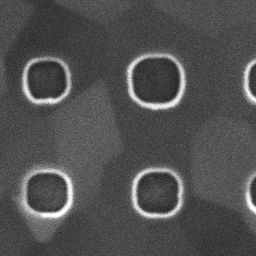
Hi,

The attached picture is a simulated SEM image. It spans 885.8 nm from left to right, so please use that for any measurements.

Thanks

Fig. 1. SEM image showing holes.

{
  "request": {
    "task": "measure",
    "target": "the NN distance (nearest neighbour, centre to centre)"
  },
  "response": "381 nm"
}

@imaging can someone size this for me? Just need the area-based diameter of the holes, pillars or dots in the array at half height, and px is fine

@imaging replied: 43.5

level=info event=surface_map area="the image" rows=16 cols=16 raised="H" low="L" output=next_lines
HHHHHHHHHHHHHHHH
HHHHHHHHHHHHHHHH
HHHHHHHHHHHHHHHH
HHHHHHHHHHHHHHHH
HHLLHHHHLLLHHHHH
HHLLHHHHLLLHHHHH
HHHHHHHHHHHHHHHH
HHHHHHHHHHHHHHHH
HHHHHHHHHHHHHHHH
HHHHHHHHHHHHHHHH
HHHHHHHHHHHHHHHH
HHLLHHHHHLLHHHHH
HHLLHHHHHLLHHHHH
HHHHHHHHHHHHHHHH
HHHHHHHHHHHHHHHH
HHHHHHHHHHHHHHHH